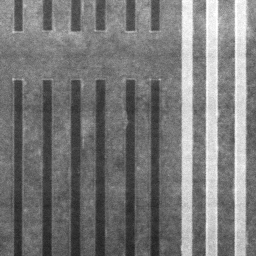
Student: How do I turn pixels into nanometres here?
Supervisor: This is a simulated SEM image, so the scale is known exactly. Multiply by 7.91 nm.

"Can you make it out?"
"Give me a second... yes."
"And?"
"parallel lines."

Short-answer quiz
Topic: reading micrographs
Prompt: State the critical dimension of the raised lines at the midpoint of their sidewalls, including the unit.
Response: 82 nm